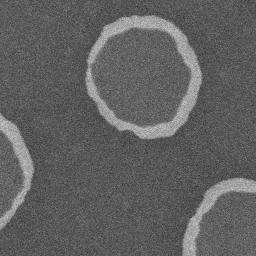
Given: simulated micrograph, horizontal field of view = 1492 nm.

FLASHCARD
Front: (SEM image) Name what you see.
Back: raised bodies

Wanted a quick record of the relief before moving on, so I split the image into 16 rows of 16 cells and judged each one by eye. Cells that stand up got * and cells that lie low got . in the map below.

................
........**......
......*****.....
......******....
......******....
......******....
......******....
.......****.....
*...............
*...............
**..............
**............*.
*............***
*...........****
............****
............****